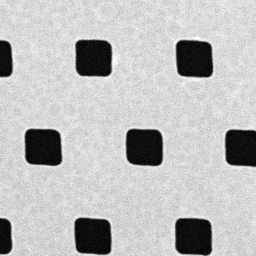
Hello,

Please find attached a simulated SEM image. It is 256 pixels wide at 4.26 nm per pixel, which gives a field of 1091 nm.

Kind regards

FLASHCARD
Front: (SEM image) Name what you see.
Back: holes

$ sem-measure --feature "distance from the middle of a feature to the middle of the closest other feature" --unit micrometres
0.431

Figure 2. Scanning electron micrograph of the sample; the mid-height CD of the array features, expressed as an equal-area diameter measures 171 nanometers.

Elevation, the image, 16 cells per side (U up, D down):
UUUUUUUUUUUUUUUU
UUUUUUUUUUUUUUUU
UUUUUDUUUUUUUUUU
DUUUUDDUUUUDDUUU
DUUUUDDUUUUDDUUU
UUUUUUUUUUUUUUUU
UUUUUUUUUUUUUUUU
UUUUUUUUUUUUUUUU
UUDDUUUUDDUUUUDD
UUDDUUUUDDUUUUDD
UUUUUUUUUUUUUUUU
UUUUUUUUUUUUUUUU
UUUUUUUUUUUUUUUU
UUUUUUUUUUUUUUUU
DUUUUDDUUUUDDUUU
DUUUUDDUUUUDDUUU